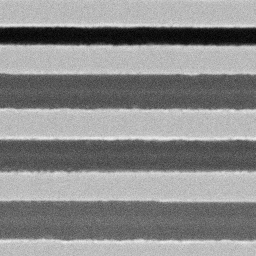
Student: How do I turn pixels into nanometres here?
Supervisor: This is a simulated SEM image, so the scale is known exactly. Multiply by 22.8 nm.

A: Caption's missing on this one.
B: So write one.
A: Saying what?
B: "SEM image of lines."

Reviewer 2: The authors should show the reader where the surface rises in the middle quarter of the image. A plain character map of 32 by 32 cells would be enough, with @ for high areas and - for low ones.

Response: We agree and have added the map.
@@@@@@@@@@@@@@@@@@@@@@@@@@@@@@@@
@@@@@@@@@@@@@@@@@@@@@@@@@@@@@@@@
------------------------------@@
--------------------------------
--------------------------------
--------------------------------
--------------------------------
--------------------------------
--------------------------------
--------------------------------
--------------------------------
@@@@@@@@@@@@@@@@@@@@@@@@@@@@@@@@
@@@@@@@@@@@@@@@@@@@@@@@@@@@@@@@@
@@@@@@@@@@@@@@@@@@@@@@@@@@@@@@@@
@@@@@@@@@@@@@@@@@@@@@@@@@@@@@@@@
@@@@@@@@@@@@@@@@@@@@@@@@@@@@@@@@
@@@@@@@@@@@@@@@@@@@@@@@@@@@@@@@@
@@@@@@@@@@@@@@@@@@@@@@@@@@@@@@@@
@@@@@@@@@@@@@@@@@@@@@@@@@@@@@@@@
--------------------------------
--------------------------------
--------------------------------
--------------------------------
--------------------------------
--------------------------------
--------------------------------
--------------------------------
@@@@@@@@@@@@@@@@@@@@@@@@@@@@@@@@
@@@@@@@@@@@@@@@@@@@@@@@@@@@@@@@@
@@@@@@@@@@@@@@@@@@@@@@@@@@@@@@@@
@@@@@@@@@@@@@@@@@@@@@@@@@@@@@@@@
@@@@@@@@@@@@@@@@@@@@@@@@@@@@@@@@